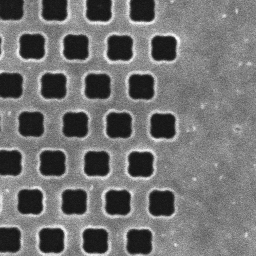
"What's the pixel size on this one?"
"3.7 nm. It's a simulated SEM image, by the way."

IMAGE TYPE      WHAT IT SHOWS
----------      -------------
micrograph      a regular array of holes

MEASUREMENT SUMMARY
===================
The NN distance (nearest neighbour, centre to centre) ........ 162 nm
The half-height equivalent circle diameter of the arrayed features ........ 95.6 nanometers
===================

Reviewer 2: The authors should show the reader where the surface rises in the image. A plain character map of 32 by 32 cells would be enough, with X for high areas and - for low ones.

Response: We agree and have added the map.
---XX---XXX---XX---XXXXXXXXXXXXX
---XX---XXX---XX---XXXXXXXXXXXXX
XXXXXXXXXXX--XXXX--XXXXXXXXXXXXX
XXXXXXXXXXXXXXXXXXXXXXXXXXXXXXXX
XXX--XXXX-XXXX--XXXXXXXXXXXXXXXX
XXX--XXX---XXX--XXX---XXXXXXXXXX
XXX--XXX---XXX---XX---XXXXXXXXXX
XXXXXXXXXXXXXXXXXXXX-XXXXXXXXXXX
XXXXXXXXXXXXXXXXXXXXXXXXXXXXXXXX
--XXXX--XXX--XXXX--XXXXXXXXXXXXX
---XX---XXX---XX---XXXXXXXXXXXXX
---XX---XXX---XX---XXXXXXXXXXXXX
XXXXXXXXXXXXXXXXXXXXXXXXXXXXXXXX
XXXXXXXXXXXXXXXXXXXXXXXXXXXXXXXX
XXX--XXX---XXX--XXX---XXXXXXXXXX
XX---XXX---XX---XXX---XXXXXXXXXX
XXX--XXX---XX---XXX---XXXXXXXXXX
XXXXXXXXXXXXXXXXXXXXXXXXXXXXXXXX
XXXXXXXXXXXXXXXXXXXXXXXXXXXXXXXX
---XX---XXX--XXX---XXXXXXXXXXXXX
---XX---XXX---XX---XXXXXXXXXXXXX
--XXX---XXX--XXX---XXXXXXXXXXXXX
XXXXXXXXXXXXXXXXXXXXXXXXXXXXXXXX
XXXXXXXXXXXXXXXXXXXXXXXXXXXXXXXX
XX---XXX---XX---XXX---XXXXXXXXXX
XX---XXX---XX---XXX---XXXXXXXXXX
XXX--XXX--XXXX--XXX---XXXXXXXXXX
XXXXXXXXXXXXXXXXXXXXXXXXXXXXXXXX
XXXXXXXXXXXXXXXXXXXXXXXXXXXXXXXX
--XXX---XX---XXX---XXXXXXXXXXXXX
--XXX---XX---XXX---XXXXXXXXXXXXX
XXXXXXXXXXX--XXX---XXXXXXXXXXXXX